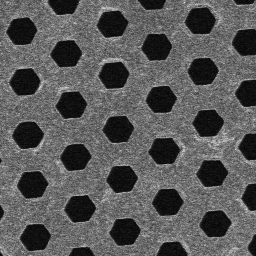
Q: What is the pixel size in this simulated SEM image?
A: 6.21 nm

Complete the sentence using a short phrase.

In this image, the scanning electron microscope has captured a regular array of holes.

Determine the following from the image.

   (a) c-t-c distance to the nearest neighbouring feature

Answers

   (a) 0.313 micrometres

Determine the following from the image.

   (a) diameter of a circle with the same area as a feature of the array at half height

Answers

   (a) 176 nanometres